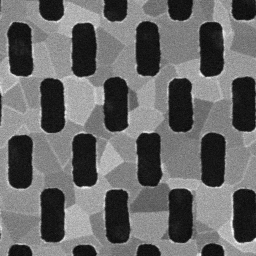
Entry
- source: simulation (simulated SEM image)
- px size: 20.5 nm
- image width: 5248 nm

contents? a regular array of holes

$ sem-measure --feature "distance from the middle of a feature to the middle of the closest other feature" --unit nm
1300